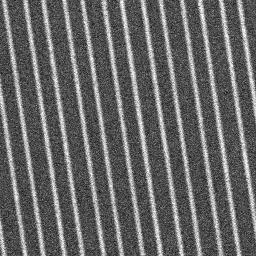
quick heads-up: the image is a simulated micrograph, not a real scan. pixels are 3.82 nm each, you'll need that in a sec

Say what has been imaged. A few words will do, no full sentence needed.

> parallel lines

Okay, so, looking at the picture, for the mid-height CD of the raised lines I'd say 0.0108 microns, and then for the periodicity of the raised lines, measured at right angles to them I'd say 19.4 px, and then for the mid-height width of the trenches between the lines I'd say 59.5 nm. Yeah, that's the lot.